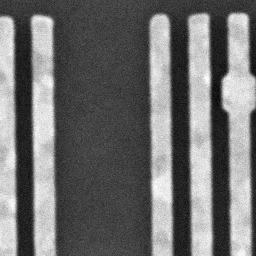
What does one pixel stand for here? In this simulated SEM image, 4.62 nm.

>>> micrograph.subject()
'wiring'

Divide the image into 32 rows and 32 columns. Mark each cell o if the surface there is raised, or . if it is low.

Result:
................................
................................
o...oo.............oo...oo...oo.
oo..ooo............oo...oo...oo.
oo..oo.............oo...oo...oo.
oo..oo.............oo...oo...oo.
oo..oo.............oo...oo...oo.
oo..ooo............oo...oo...oo.
oo..ooo............oo...oo...oo.
oo..ooo............oo...oo..ooo.
oo..ooo............oo...oo..oooo
oo..ooo............oo...oo..oooo
oo..ooo............oo...oo..oooo
oo..ooo............oo...oo..oooo
oo..ooo............oo...oo...oo.
oo..ooo............oo...oo...oo.
oo..ooo............oo...oo...oo.
oo..ooo............oo...oo...oo.
oo..ooo............oo...oo...oo.
oo..ooo............oo...oo...oo.
oo..ooo............oo...oo...oo.
oo..ooo............oo...oo...oo.
oo..ooo............oo...oo...oo.
oo..ooo............oo...oo...oo.
oo..ooo............oo...oo...oo.
oo..ooo............oo...oo...oo.
oo..ooo............oo...oo...oo.
oo..ooo............oo...oo...oo.
oo..ooo............oo...oo...oo.
oo..ooo............oo...oo...oo.
oo..ooo............oo...oo...oo.
oo..ooo............oo...oo...oo.